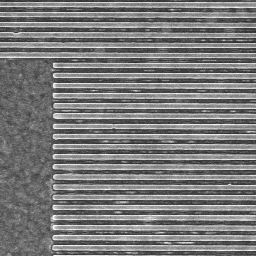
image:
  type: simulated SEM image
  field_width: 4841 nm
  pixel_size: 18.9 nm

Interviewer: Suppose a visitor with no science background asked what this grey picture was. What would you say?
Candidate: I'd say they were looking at parallel lines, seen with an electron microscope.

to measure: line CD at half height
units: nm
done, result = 102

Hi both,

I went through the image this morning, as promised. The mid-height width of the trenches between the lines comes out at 89.8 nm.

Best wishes